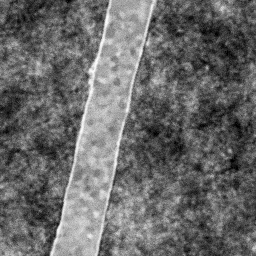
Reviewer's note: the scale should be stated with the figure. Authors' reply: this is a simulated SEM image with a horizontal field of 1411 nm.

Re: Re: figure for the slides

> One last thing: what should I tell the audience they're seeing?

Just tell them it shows one or a few lines or trenches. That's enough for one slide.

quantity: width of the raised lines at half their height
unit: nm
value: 227